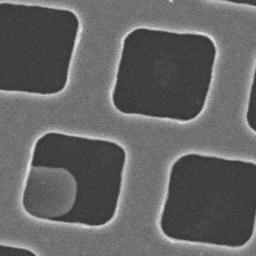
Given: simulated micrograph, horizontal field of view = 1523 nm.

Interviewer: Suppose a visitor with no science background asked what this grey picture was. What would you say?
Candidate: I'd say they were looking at holes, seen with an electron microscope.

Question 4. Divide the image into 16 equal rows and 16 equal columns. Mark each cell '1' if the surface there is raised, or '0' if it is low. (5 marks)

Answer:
0001111111111111
0000011111111111
0000011100000111
0000111100000111
0000111000000111
0000111000000111
1111111000000111
1111111111101110
1110011111111111
1100000011111111
1100000011100000
1100000011100000
1000000111000000
1100000111000000
1111111111000000
0111111111111111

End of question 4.